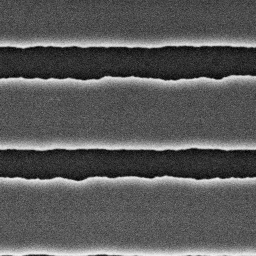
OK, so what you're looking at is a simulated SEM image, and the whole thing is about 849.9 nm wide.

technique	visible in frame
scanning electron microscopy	lines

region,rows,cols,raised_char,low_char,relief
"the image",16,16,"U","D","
UUUUUUUUUUUUUUUU
UUUUUUUUUUUUUUUU
UUUUUUUUUUUUUUUU
DDDDDDDDDDDDDDDD
DDDDDDDDDDDDDDDD
UUUUUUUUUUUUUUUU
UUUUUUUUUUUUUUUU
UUUUUUUUUUUUUUUU
UUUUUUUUUUUUUUUU
DDDDDDDDDDDDDDDD
DDDDDDDDDDDDDDDD
UUUUUUUUUUUUUUUU
UUUUUUUUUUUUUUUU
UUUUUUUUUUUUUUUU
UUUUUUUUUUUUUUUU
UUUUUUUUUUUUUUUU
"